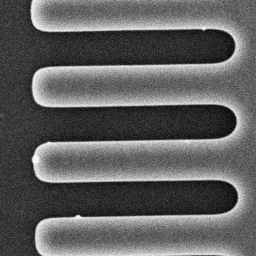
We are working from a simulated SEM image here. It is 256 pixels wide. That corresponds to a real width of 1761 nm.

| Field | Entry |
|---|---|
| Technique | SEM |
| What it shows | groups of lines, slits or small figures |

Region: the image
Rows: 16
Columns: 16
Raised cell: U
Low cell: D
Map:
DDUUUUUUUUUUUUUU
DDUUUUUUUUUUUUUU
DDDDDDDDDDDDDDDU
DDDDDDDDDDDDDDUU
DDUUUUUUUUUUUUUU
DDUUUUUUUUUUUUUU
DDDUUUUUUUUUDUUU
DDDDDDDDDDDDDDDU
DDDDDDDDDDDDDDUU
DDUUUUUUUUUUUUUU
DDUUUUUUUUUUUUUU
DDDDDDDDDDDDDDUU
DDDDDDDDDDDDDDDU
DDDDDDDDDDUUUUUU
DDUUUUUUUUUUUUUU
DDUUUUUUUUUUUUUU